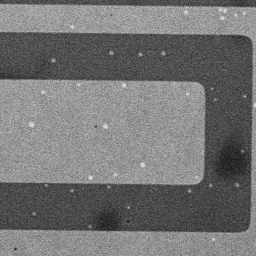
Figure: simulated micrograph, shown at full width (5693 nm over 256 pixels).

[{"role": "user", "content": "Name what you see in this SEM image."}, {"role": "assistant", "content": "groups of lines, slits or small figures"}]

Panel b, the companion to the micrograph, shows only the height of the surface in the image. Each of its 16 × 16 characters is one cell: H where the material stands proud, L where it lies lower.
HHHHHHHHHHHHHHHH
HHHHHHHHHHHHHHHH
LLLLLLLLLLLLLLLL
LLLLLLLLLLLLLLLL
LLLLLLLLLLLLLLLL
HHHHHHHHHHHHHLLL
HHHHHHHHHHHHHLLL
HHHHHHHHHHHHHLLL
HHHHHHHHHHHHHLLL
HHHHHHHHHHHHHLLL
HHHHHHHHHHHHHLLL
LLLLLLLLLLLHLLLL
LLLLLLLLLLLLLLLL
LLLLLLLLLLLLLLLL
HHHHHHHHLLLLLLLH
HHHHHHHHHHHHHHHH